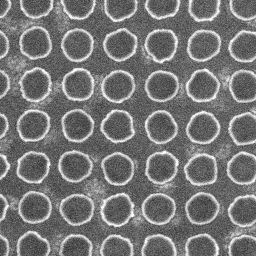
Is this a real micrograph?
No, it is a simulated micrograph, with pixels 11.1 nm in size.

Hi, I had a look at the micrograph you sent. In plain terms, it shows a regular array of raised bodies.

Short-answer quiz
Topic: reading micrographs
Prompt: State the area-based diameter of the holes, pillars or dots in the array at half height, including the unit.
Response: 0.357 µm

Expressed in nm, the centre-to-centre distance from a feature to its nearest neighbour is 451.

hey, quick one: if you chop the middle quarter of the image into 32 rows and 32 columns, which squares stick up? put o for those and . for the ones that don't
................................
...oo...........................
.ooooo......oooo......ooooo.....
ooooooo...ooooooo....ooooooo....
ooooooo...ooooooo....ooooooo...o
ooooooo...oooooooo...ooooooo...o
ooooooo...ooooooo....ooooooo...o
ooooooo...ooooooo....ooooooo...o
.ooooo.....ooooo......ooooo.....
.............o..................
................................
................................
.ooooo.....ooooo......oooo......
ooooooo....oooooo....oooooo.....
ooooooo...ooooooo....ooooooo....
ooooooo...ooooooo....ooooooo...o
ooooooo..oooooooo....ooooooo...o
ooooooo...ooooooo....ooooooo...o
.ooooo.....ooooo.....oooooo.....
.......................ooo......
................................
................................
ooooo.......oo.........ooo......
oooooo.....ooooo.....ooooooo....
ooooooo...ooooooo....ooooooo...o
ooooooo...ooooooo....ooooooo..oo
ooooooo...ooooooo....ooooooo..oo
oooooo....ooooooo....ooooooo...o
ooooo.....ooooooo....oooooo....o
...........ooooo.......oo.......
................................
................................